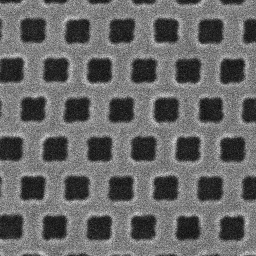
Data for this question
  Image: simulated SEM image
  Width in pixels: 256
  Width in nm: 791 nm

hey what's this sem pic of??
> a regular array of holes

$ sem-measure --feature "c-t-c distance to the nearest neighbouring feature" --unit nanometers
136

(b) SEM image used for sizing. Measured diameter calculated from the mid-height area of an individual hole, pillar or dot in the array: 84.7 nanometres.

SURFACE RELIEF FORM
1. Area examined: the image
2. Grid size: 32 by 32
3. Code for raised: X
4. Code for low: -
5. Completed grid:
XXXXXXXXXXX-XXXXX-XXXX---XXX--XX
XXXXXXXXXXXXXXXXXXXXXXXXXXXXXXXX
XXX--XXXX--XXX---XXX--XXX---XXX-
XXX---XX---XXX---XX---XXX---XXX-
XXX---XX---XXX---XX---XXX---XX--
XXXXXXXXXXXXXXXXXXXXXXXXXX-XXXXX
XXXXXXXXXXXXXXXXXXXXXXXXXXXXXXXX
---XXX--XXX---XXX--XXX---XXX--XX
---XX---XXX---XXX---XX---XX----X
---XX----XX---XX----XX---XX----X
XXXXXXXXXXXXXXXXXXXXXXXXXXXXXXXX
XXXXXXXXXXXXXXXXXXXXXXXXXXXXXXXX
XXX---XX---XXX---XXX--XXX---XXX-
XXX---XX---XXX---XX---XXX---XX--
XXX---XX---XXX---XX---XXX---XX--
XXXXXXXXXXXXXXXXXXXXXXXXXXXXXXXX
XXXXXXXXXXXXXXXXXXXXXXXXXXXXXXXX
---XXX--XXX---XXX---XX---XXX---X
---XX---XXX---XX----XX---XXX---X
---XX---XXX---XX----XX---XXX---X
XXXXXXXXXXXXXXXXXXXXXXXXXXXXXXXX
XXXXXXXXXXXXXXXXXXXXXXXXXXXXXXXX
XXX---XX---XXX---XX---XXX---XX--
XXX---XX---XXX---XX---XXX---XX--
XXX---XX---XXX---XX---XXX---XX--
XXXXXXXXXXXXXXXXXXXXXXXXXXXXXXXX
XXXXXXXXXXXXXXXXXXXXXXXXXXXXXXXX
---XX---XXX---XX---XXX---XXX---X
---XX---XXX---XX---XXX---XXX---X
---XX---XXX---XX---XXX---XX----X
XXXXXXXXXXXXXXXXXXXXXXXXXXXXXXXX
XXXXXXXXXXXXXXXXXXXXXXXXXXXXXXXX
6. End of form